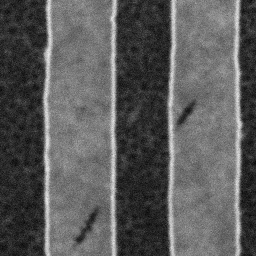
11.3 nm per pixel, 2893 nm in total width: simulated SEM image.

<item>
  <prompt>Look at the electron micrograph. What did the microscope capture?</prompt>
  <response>one or a few lines or trenches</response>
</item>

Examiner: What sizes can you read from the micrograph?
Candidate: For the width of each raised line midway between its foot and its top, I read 661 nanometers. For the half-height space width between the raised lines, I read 65.9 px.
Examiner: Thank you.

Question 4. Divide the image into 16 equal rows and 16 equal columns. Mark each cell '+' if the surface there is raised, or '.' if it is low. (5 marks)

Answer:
+++....++++....+
+++....++++....+
+++....++++....+
+++....++++....+
+++....++++....+
+++....++++....+
+++....++++....+
+++....++++....+
+++....++++....+
+++....++++....+
+++....++++....+
+++....++++....+
+++....++++....+
+++....++++....+
+++....++++....+
+++....++++....+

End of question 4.